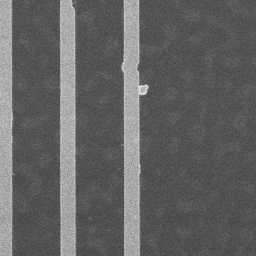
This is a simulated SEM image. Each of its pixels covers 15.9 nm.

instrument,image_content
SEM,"parallel lines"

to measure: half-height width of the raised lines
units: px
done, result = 14.6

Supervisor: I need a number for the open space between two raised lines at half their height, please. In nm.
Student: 776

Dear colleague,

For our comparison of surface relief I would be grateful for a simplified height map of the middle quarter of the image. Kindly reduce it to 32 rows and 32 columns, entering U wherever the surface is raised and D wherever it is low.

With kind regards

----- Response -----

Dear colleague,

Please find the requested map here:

UUUDDDDDDDDDDDDUUUDDDDDDDDDDDDDD
UUUDDDDDDDDDDDDUUUDDDDDDDDDDDDDD
UUUDDDDDDDDDDDDUUUUDDDDDDDDDDDDD
UUUDDDDDDDDDDDDUUUUDDDDDDDDDDDDD
UUUDDDDDDDDDDDDUUUUDDDDDDDDDDDDD
UUUDDDDDDDDDDDDUUUUUDDDDDDDDDDDD
UUUDDDDDDDDDDDDUUUUUUDDDDDDDDDDD
UUUDDDDDDDDDDDDUUUUUDDDDDDDDDDDD
UUUDDDDDDDDDDDDUUUUDDDDDDDDDDDDD
UUUDDDDDDDDDDDDUUUUDDDDDDDDDDDDD
UUUDDDDDDDDDDDDUUUUDDDDDDDDDDDDD
UUUDDDDDDDDDDDDUUUUDDDDDDDDDDDDD
UUUDDDDDDDDDDDDUUUUDDDDDDDDDDDDD
UUUDDDDDDDDDDDDUUUUDDDDDDDDDDDDD
UUUDDDDDDDDDDDDUUUUDDDDDDDDDDDDD
UUUDDDDDDDDDDDDUUUUDDDDDDDDDDDDD
UUUDDDDDDDDDDDDUUUUDDDDDDDDDDDDD
UUUDDDDDDDDDDDDUUUUDDDDDDDDDDDDD
UUUDDDDDDDDDDDDUUUUDDDDDDDDDDDDD
UUUDDDDDDDDDDDDUUUUDDDDDDDDDDDDD
UUUDDDDDDDDDDDDUUUUDDDDDDDDDDDDD
UUUDDDDDDDDDDDDUUUUDDDDDDDDDDDDD
UUUDDDDDDDDDDDDUUUUDDDDDDDDDDDDD
UUUDDDDDDDDUDDDUUUUDDDDDDDDDDDDD
UUUDDDDDDDDDDDDUUUUDDDDDDDDDDDDD
UUUDDDDDDDDDDDDUUUUDDDDDDDDDDDDD
UUUDDDDDDDDDDDDUUUUDDDDDDDDDDDDD
UUUDDDDDDDDDDDDUUUUDDDDDDDDDDDDD
UUUDDDDDDDDDDDDUUUUDDDDDDDDDDDDD
UUUDDDDDDDDDDDDUUUUDDDDDDDDDDDDD
UUUDDDDDDDDDDDDUUUUDDDDDDDDDDDDD
UUUDDDDDDDDDDDDUUUUDDDDDDDDDDDDD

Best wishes